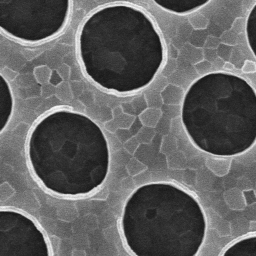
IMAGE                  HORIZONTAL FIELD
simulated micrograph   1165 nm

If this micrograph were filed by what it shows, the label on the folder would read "holes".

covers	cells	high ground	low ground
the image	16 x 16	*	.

....***.**..****
....*....******.
*****.....******
*****.....******
*****.....******
.******..***....
.**********.....
.**...*****.....
**....******....
**.....******..*
**.....*********
***...**********
********....****
.*******.....***
..******.....***
...*****....**..